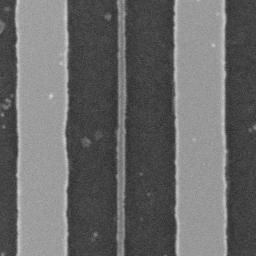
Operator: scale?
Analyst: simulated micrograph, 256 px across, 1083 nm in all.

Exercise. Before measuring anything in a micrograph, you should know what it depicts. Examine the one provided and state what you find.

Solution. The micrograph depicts lines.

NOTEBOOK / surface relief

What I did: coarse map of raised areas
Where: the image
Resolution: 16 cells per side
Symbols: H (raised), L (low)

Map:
LHHHLLLLLLLHHHLL
LHHHLLLLLLLHHHLL
LHHHLLLLLLLHHHLL
LHHHLLLLLLLHHHLL
LHHHLLLLLLLHHHLL
LHHHLLLLLLLHHHLL
LHHHLLLLLLLHHHLL
LHHHLLLLLLLHHHLL
LHHHLLLLLLLHHHLL
LHHHLLLLLLLHHHLL
LHHHLLLLLLLHHHLL
LHHHLLLLLLLHHHLL
LHHHLLLLLLLHHHLL
LHHHLLLLLLLHHHLL
LHHHLLLLLLLHHHLL
LHHHLLLLLLLHHHLL